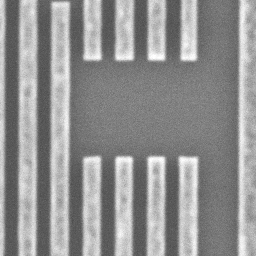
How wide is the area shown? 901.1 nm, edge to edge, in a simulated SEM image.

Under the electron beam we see wiring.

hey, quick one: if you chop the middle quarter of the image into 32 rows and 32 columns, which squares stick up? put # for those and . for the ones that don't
#...............................
#...............................
#...............................
#...............................
#...............................
#...............................
#...............................
#...............................
#...............................
#...............................
#...............................
#...............................
#...............................
#...............................
#...............................
#...............................
#...............................
#...............................
#...............................
#...............................
#...............................
#...............................
#...............................
#.....###....####....####....##.
#....####....####....####....###
#....####....####....####....###
#....####....####....####....###
#....####....####....####....###
#....####....####....####....###
#....####....####....####....###
#....####....####....####....###
#....####....####....####....###